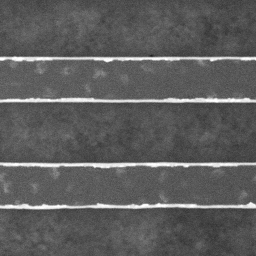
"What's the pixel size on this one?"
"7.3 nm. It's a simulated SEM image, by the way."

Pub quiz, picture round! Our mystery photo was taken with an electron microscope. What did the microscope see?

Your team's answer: one or a few lines or trenches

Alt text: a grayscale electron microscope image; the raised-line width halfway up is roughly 43.3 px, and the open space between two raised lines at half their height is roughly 458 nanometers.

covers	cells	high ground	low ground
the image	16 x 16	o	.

................
................
................
................
oooooooooooooooo
oooooooooooooooo
................
................
................
................
oooooooooooooooo
oooooooooooooooo
oooooooooooooooo
................
................
................